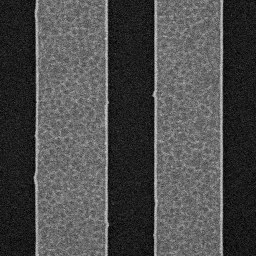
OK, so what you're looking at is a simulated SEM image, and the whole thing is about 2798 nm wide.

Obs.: one or a few lines or trenches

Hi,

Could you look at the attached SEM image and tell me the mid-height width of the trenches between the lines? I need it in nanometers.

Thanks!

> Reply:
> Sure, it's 537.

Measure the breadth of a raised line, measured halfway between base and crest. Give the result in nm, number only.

743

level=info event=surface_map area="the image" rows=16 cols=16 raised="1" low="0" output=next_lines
0011111000111100
0011111000111100
0011111000111100
0011111000111100
0011111000111100
0011111000111100
0011111000111100
0011111000111100
0011111000111100
0011111000111100
0011111000111100
0011111000111100
0011111000111100
0011111000111100
0011111000111100
0011111000111100